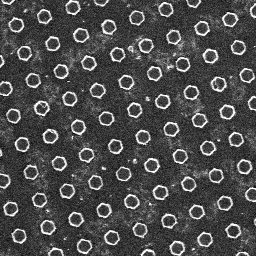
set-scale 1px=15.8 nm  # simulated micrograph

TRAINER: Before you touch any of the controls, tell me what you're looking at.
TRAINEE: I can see a regular array of raised bodies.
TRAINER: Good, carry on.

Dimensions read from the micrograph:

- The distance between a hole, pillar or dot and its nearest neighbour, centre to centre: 455 nanometers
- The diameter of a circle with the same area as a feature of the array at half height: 0.216 microns